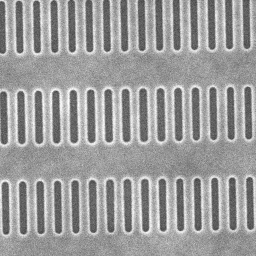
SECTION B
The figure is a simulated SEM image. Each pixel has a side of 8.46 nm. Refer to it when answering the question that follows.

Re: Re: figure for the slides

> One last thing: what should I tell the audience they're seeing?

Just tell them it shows groups of lines, slits or small figures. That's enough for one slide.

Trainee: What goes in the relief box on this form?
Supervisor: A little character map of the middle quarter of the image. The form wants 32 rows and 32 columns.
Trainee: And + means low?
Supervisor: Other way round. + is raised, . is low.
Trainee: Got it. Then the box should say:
++++++++++++++++++++++++++++++++
++++++++++++++++++++++++++++++++
++++++++++++++++++++++++++++++++
++++++++++++++++++++++++++++++++
++++++++++++++++++++++++++++++++
++++++++++++++++++++++++++++++++
++++++.+++..+++.+++..++..+++..++
+..++...++..++...+...++..++...++
+..++...++..++...+...++..++...++
+..++...++..++...+...++..++...++
+...+...++..++...+...++..++...++
+...+...++..++...+...++...+...++
+...+...++..++...+...++...+...++
+...++..++...+...+...++...+...++
+...++..++...+...++..++...+...++
+...++..++...+...++..++...+...++
+...++..++...+...++..++...++..++
+...++..++...+...++..++...++..++
+...++..++...+...++..++...++..++
+..+++..+++.+++.+++..+++.+++++++
++++++++++++++++++++++++++++++++
++++++++++++++++++++++++++++++++
++++++++++++++++++++++++++++++++
++++++++++++++++++++++++++++++++
++++++++++++++++++++++++++++++++
++++++++++++++++++++++++++++++++
++++++++++++++++++++++++++++++++
++++++++++++++++++++++++++++++++
++++++++++++++++++++++++++++++++
++..++..+++..++..++..+++..++..++
++..++..++...+...++..++...++..++
++..++..++...++..++..+++..++..++